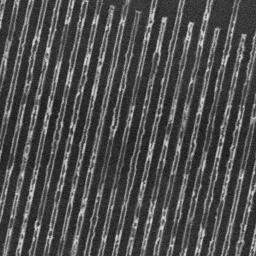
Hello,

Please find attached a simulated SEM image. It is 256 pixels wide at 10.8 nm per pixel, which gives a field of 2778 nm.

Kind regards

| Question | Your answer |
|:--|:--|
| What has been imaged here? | parallel lines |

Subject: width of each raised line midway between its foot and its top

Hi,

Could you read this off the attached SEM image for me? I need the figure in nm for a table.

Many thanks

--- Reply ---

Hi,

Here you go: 53.1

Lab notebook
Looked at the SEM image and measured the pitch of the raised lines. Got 13.4 pixels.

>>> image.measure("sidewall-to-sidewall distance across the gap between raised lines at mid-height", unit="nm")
95.5